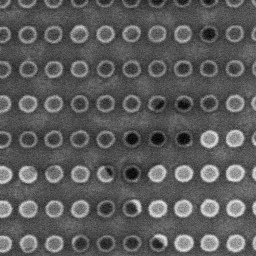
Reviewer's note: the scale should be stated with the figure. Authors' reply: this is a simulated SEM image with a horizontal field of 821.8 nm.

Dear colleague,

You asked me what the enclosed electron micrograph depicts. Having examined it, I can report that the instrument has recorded a regular array of raised bodies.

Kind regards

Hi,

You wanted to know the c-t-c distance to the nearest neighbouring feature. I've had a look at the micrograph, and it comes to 82.6 nm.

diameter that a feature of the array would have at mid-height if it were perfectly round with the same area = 51.9 nanometers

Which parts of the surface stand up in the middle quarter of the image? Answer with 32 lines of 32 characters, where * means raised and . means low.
..****...***...****..****...****
..****..****...****..****...****
..***....***...****...***...***.
................................
................................
................................
................................
................................
...**....***....**....***....**.
..****...***...****..****...****
..****...***...****..****...****
...**....***....**....**.....**.
................................
................................
................................
................................
................................
..****...***...***....***...****
..****..****...****..****...****
..****..****...****..****...****
...**....**.....................
................................
................................
................................
................................
................................
..****...***...****...***...****
..****...***...****..****...****
..****...***...***....***...****
................................
................................
................................